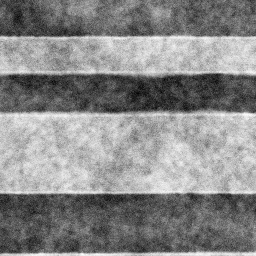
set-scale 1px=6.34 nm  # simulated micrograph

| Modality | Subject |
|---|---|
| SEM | lines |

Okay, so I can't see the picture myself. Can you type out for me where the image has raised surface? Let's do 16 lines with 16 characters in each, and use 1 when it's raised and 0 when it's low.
0000000000000000
0000000000000000
1111111111111111
1111111111111111
1111111111111111
0000000000000000
0000000000000000
1111111111111111
1111111111111111
1111111111111111
1111111111111111
1111111111111111
0000000000000000
0000000000000000
0000000000000000
0000000000000000